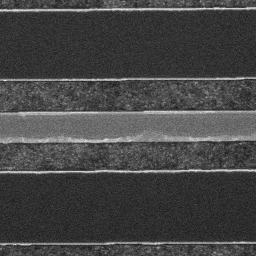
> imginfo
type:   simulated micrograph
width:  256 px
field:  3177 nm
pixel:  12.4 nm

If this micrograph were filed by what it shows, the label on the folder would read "lines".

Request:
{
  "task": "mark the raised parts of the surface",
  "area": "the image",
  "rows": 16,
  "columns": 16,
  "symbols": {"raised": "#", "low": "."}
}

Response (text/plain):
...............#
################
################
################
################
................
................
################
################
................
................
################
################
################
################
................